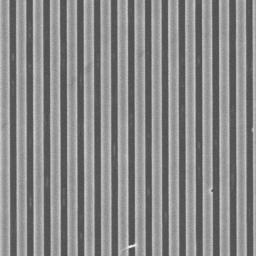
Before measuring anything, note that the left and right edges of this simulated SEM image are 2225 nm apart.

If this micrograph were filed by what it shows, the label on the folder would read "parallel lines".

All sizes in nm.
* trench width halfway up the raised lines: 61.9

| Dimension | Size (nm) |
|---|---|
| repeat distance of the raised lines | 147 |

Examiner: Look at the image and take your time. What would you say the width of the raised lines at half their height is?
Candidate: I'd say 0.0858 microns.